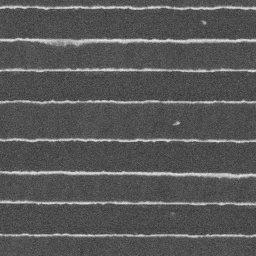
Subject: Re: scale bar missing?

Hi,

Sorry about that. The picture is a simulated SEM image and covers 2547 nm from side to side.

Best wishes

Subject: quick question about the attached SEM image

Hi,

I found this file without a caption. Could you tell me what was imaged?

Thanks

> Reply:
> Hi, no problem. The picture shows lines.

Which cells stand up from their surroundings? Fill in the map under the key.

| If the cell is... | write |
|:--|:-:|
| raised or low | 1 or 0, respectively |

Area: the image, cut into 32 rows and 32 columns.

11111111111111111111111111111111
00000000000000000000000000000000
00000000000000000000000000000000
00000000000000000000000000000000
00000000000000000000000000000000
11111111111111111111111111111111
11111111111111111111111111111111
11111111111111111111111111111111
11111111111111111111111111111111
00000000000000000000000000000000
00000000000000000000000000000000
00000000000000000000000000000000
00000000000000000000000000000000
11111111111111111111111111111111
11111111111111111111111111111111
11111111111111111111111111111111
11111111111111111111111111111111
11111111111111111111111111111111
00000000000000000000000000000000
00000000000000000000000000000000
00000000000000000000000000000000
10000000000000000000000000000000
11111111111111111111111111111111
11111111111111111111111111111111
11111111111111111111111111111111
00000000000000000000000011010111
00000000000000000000000000000000
00000000000000000000000000000000
00000000000000000000000000000000
11111111111111111111111101111111
11111111111111111111111111111111
11111111111111111111111111111111